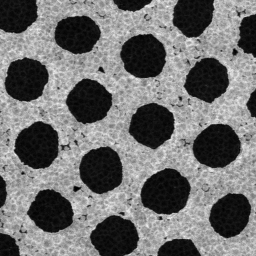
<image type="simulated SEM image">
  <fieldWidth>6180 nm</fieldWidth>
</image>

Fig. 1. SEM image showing a regular array of holes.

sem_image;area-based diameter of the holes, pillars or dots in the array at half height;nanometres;1020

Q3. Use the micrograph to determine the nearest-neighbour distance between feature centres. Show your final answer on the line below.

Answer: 1.61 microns